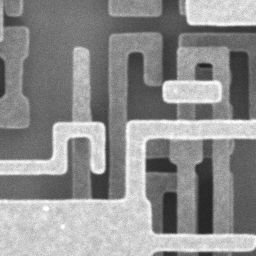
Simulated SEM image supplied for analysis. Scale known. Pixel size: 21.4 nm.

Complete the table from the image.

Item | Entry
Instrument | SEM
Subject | wiring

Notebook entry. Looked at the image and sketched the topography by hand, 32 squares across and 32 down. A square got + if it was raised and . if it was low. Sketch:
.......................+++++++++
.......................+++++++++
.......................+++++++++
................................
................................
................................
.........++...........+++++++...
.........++...........+++++++...
.........++...........++...++...
.........++...........++...++...
.........++..........++++++++...
.........++.........+++++++++...
.........++..........++++++++...
.........++...........++...++...
.........++...........++...++...
.......++++++...++++++++++++++++
.......++++++...++++++++++++++++
.......++++++...+++..++++++++...
.......+.++++...++...++++..++...
.......+.++++...++...++++..++...
++++++++.++++...++....+++..++...
++++++++.++++...++....++...++...
.........++.....++....++...++...
.........++.....++....++...++...
.........++.....++....++...++...
+++++++++++++++++++...++...++...
+++++++++++++++++++...++...++...
+++++++++++++++++++...++...++...
+++++++++++++++++++...++...++...
++++++++++++++++++++++++++++++++
++++++++++++++++++++++++++++++++
+++++++++++++++++++...+++.+++...